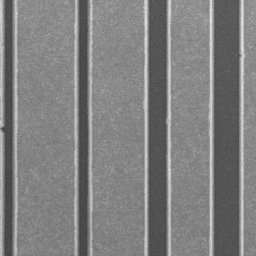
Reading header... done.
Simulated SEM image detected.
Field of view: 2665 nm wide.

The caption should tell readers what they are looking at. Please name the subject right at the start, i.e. one or a few lines or trenches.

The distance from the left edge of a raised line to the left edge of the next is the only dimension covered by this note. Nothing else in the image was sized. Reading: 72.2 pixels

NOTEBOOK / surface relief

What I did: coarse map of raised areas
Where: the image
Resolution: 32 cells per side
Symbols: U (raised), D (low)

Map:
DDUUUUUUUDDUUUUUUUDDDUUUUUDDDDUU
DDUUUUUUUDDUUUUUUUDDDUUUUUDDDDUU
DDUUUUUUUDDUUUUUUUDDDUUUUUDDDDUU
DDUUUUUUUDDUUUUUUUDDDUUUUUDDDDUU
DDUUUUUUUDDUUUUUUUDDDUUUUUDDDDUU
DDUUUUUUUDDUUUUUUUDDDUUUUUDDDDUU
DDUUUUUUUDDUUUUUUUDDDUUUUUDDDDUU
DDUUUUUUUDDUUUUUUUDDDUUUUUDDDDUU
DDUUUUUUUDDUUUUUUUDDDUUUUUDDDDUU
DDUUUUUUUDDUUUUUUUDDDUUUUUDDDDUU
DDUUUUUUUDDUUUUUUUDDDUUUUUDDDDUU
DDUUUUUUUDDUUUUUUUDDDUUUUUDDDDUU
DDUUUUUUUDDUUUUUUUDDDUUUUUDDDDUU
DDUUUUUUUDDUUUUUUUDDDUUUUUDDDDUU
DDUUUUUUUDDUUUUUUUDDDUUUUUDDDDUU
DDUUUUUUUDDUUUUUUUDDDUUUUUDDDDUU
DDUUUUUUUDDUUUUUUUDDDUUUUUDDDDUU
DDUUUUUUUDDUUUUUUUDDDUUUUUDDDDUU
DDUUUUUUUDDUUUUUUUDDDUUUUUDDDDUU
DDUUUUUUUDDUUUUUUUDDDUUUUUDDDDUU
DDUUUUUUUDDUUUUUUUDDDUUUUUDDDDUU
DDUUUUUUUDDUUUUUUUDDDUUUUUDDDDUU
DDUUUUUUUDDUUUUUUUDDDUUUUUDDDDUU
DDUUUUUUUDDUUUUUUUDDDUUUUUDDDDUU
DDUUUUUUUDDUUUUUUUDDDUUUUUDDDDUU
DDUUUUUUUDDUUUUUUUDDDUUUUUDDDDUU
DDUUUUUUUDDUUUUUUUDDDUUUUUDDDDUU
DDUUUUUUUDDUUUUUUUDDDUUUUUDDDDUU
DDUUUUUUUDDUUUUUUUDDDUUUUUDDDDUU
DDUUUUUUUDDUUUUUUUDDDUUUUUDDDDUU
DDUUUUUUUDDUUUUUUUDDDUUUUUDDDDUU
DDUUUUUUUDDUUUUUUUDDDUUUUUDDDDUU